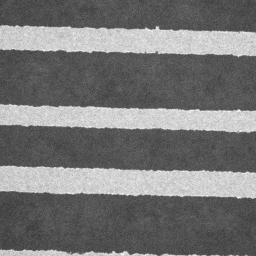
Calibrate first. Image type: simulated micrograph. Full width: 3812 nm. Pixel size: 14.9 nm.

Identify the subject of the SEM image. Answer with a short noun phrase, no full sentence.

one or a few lines or trenches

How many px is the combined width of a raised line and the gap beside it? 70.7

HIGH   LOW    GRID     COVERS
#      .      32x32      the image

................................
................................
................................
#########.#.....................
################################
################################
.............#.#################
................................
................................
................................
................................
................................
................................
#############...................
################################
################################
................................
................................
................................
................................
................................
###########################.#...
################################
################################
...........................#####
................................
................................
................................
................................
................................
................................
########........................